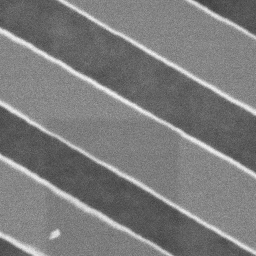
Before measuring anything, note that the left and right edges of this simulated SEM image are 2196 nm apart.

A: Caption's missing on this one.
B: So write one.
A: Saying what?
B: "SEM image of lines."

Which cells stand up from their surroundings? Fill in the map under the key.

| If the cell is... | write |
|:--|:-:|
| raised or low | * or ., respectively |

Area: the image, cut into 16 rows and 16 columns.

....*********...
......*********.
*.......********
***.......******
*****......*****
*******......***
********.......*
..********......
...*********....
.....*********..
**.....********.
***.....********
*****.....******
*******.....****
********.....***
.*********.....*